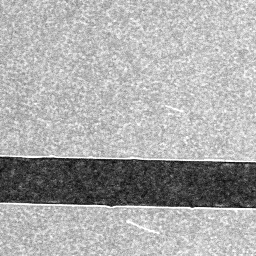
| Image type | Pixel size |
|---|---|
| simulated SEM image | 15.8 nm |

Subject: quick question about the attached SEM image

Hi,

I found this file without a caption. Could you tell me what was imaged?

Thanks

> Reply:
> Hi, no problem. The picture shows one or a few lines or trenches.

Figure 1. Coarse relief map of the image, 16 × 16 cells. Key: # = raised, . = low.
################
################
################
################
################
################
################
################
################
################
................
................
................
################
################
################